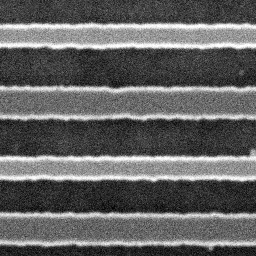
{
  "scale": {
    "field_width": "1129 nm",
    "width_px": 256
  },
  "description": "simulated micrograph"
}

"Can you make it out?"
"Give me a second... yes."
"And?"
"lines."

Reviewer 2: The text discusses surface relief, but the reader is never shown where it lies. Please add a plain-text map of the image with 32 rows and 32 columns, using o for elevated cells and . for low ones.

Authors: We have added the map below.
................................
................................
................................
oooooooooooooooooooooooooooooooo
oooooooooooooooooooooooooooooooo
oooooooooooooooooooooooooooooooo
................................
................................
................................
................................
................................
oooooooooooooooooooooooooooooooo
oooooooooooooooooooooooooooooooo
oooooooooooooooooooooooooooooooo
oooooooooooooooooooooooooooooooo
................................
................................
................................
................................
................................
oooooooooooooooooooooooooooooooo
oooooooooooooooooooooooooooooooo
...................o..........o.
................................
................................
................................
................................
oooooooooooooooooooooooooooooooo
oooooooooooooooooooooooooooooooo
oooooooooooooooooooooooooooooooo
oooooooooooooooooooooooooooooooo
................................